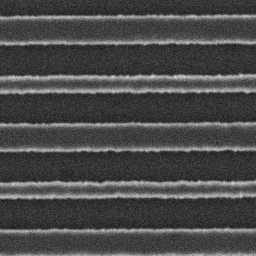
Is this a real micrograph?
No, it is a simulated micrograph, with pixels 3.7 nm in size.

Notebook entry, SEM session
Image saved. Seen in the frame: lines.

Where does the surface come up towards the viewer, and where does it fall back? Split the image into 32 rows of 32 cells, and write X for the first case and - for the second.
--------------------------------
--------------------------------
XXXXXXXXXXXXXXXXXXXXXXXXXXXXXXXX
XXXXXXXXXXXXXXXXXXXXXXXXXXXXXXXX
XXXXXXXXXXXXXXXXXXXXXXXXXXXXXXXX
XXXX----X-----X-----------------
--------------------------------
--------------------------------
--------------------------------
------XXXXXXX----XXXXXXXXX-XXXXX
XXXXXXXXXXXXXXXXXXXXXXXXXXXXXXXX
XXXXXX-XX-XX----XX----X---------
--------------------------------
--------------------------------
--------------------------------
XXXXXXXXXXXXXXXXXXXXXXXXXXXXXXXX
XXXXXXXXXXXXXXXXXXXXXXXXXXXXXXXX
XXXXXXXXXXXXXXXXXXXXXXXXXXXXXXXX
XXXXXXXXXXXXXXXXXXXXXXXXXXXXXXXX
--------------------------------
--------------------------------
--------------------------------
--------------------------------
XXXXXXXXXXXXXXXXXXXXXXXXXXXXXXXX
XXXXXXXXXXXXXXXXXXXXXXXXXXXXXXXX
--------------------------------
--------------------------------
--------------------------------
--------------------------------
XXXXXXXXXXXXXXXXXXXXXXXXXXXXXXXX
XXXXXXXXXXXXXXXXXXXXXXXXXXXXXXXX
XXXXXXXXXXXXXXXXXXXXXXXXXXXXXXXX